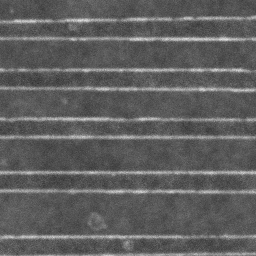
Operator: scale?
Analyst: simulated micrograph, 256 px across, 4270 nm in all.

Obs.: lines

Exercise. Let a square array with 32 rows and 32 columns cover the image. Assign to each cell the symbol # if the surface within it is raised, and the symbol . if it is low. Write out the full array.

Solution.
................................
................................
...............#################
################################
################################
................................
................................
................................
................................
################################
################################
................................
................................
................................
................................
################################
################################
................................
................................
................................
................................
................................
################################
################################
................................
................................
................................
................................
................................
................................
################################
################################